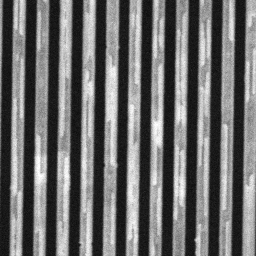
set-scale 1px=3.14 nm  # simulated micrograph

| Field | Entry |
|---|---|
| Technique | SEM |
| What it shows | parallel lines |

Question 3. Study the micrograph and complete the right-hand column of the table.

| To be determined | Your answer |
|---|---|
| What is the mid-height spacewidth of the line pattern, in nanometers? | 41.3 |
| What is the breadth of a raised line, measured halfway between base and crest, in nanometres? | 33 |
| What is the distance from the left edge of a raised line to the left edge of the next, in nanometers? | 73.2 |